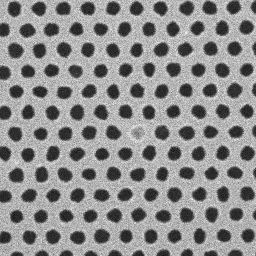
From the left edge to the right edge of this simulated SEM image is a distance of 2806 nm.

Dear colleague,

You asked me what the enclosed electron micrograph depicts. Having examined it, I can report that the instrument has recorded a regular array of holes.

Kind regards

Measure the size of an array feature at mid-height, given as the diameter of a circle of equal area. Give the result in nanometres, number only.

162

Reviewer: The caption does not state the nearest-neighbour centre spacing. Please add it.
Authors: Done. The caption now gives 256 nanometers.